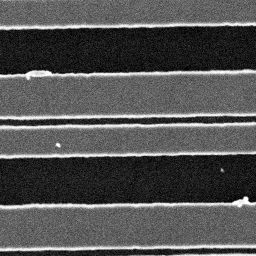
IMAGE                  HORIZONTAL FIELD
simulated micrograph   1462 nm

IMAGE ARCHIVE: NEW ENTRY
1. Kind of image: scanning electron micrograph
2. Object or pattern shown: lines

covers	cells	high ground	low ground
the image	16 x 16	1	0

1111111111111111
1111111111111111
0000000000000000
0000000000000000
0010000000000001
1111111111111111
1111111111111111
1111111111111111
1111111111111111
1111111111111111
0000000000000000
0000000000000000
0000000000000000
1111111111111111
1111111111111111
1111111111111111